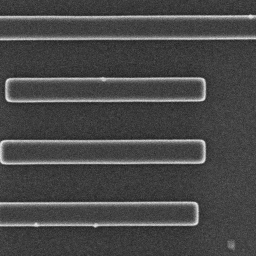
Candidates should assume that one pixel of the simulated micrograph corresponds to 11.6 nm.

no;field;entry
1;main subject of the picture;groups of lines, slits or small figures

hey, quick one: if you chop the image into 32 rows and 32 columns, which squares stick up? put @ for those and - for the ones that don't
--------------------------------
--------------------------------
@@@@@@@@@@@@@@@@@@@@@@@@@@@@@@@@
@@@@@@@@@@@@@@@@@@@@@@@@@@@@@@@@
@@@@@@@@@@@@@@@@@@@@@@@@@@@@@@@@
--------------------------------
--------------------------------
--------------------------------
--------------------------------
--------------------------------
-@@@@@@@@@@@@@@@@@@@@@@@@@------
-@@@@@@@@@@@@@@@@@@@@@@@@@------
-@@@@@@@@@@@@@@@@@@@@@@@@-------
--------------------------------
--------------------------------
--------------------------------
--------------------------------
--------------------------------
@@@@@@@@@@@@@@@@@@@@@@@@@@------
@@@@@@@@@@@@@@@@@@@@@@@@@@------
--------------------------------
--------------------------------
--------------------------------
--------------------------------
--------------------------------
@@@@@@@@@@@@@@@@@@@@@@@@--------
@@@@@@@@@@@@@@@@@@@@@@@@@-------
@@@@@@@@@@@@@@@@@@@@@@@@@-------
--------------------------------
--------------------------------
--------------------------------
--------------------------------